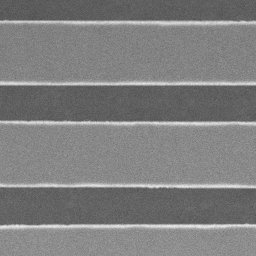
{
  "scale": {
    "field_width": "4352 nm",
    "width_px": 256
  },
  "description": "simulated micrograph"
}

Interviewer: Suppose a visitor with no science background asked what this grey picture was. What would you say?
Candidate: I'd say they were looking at lines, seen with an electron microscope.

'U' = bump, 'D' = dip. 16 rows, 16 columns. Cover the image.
DDDDDDDDDDDDDDDD
UUUUUUUUUUUUUUUU
UUUUUUUUUUUUUUUU
UUUUUUUUUUUUUUUU
UUUUUUUUUUUUUUUU
DDDDDDDDDDDDDDDD
DDDDDDDDDDDDDDDD
DDDDDDDDDDDDDDDD
UUUUUUUUUUUUUUUU
UUUUUUUUUUUUUUUU
UUUUUUUUUUUUUUUU
UUUUUUUUUUUUUUUU
DDDDDDDDDDDDDDDD
DDDDDDDDDDDDDDDD
UUUUUUUUUUUUUUUU
UUUUUUUUUUUUUUUU